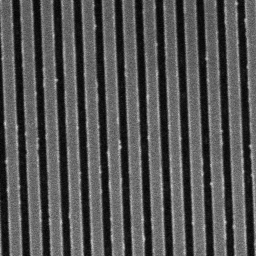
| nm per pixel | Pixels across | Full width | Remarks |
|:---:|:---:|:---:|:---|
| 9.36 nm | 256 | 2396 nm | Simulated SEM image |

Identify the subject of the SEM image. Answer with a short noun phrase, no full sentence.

parallel lines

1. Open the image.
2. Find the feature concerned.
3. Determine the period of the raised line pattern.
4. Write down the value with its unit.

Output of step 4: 191 nm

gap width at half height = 0.0748 microns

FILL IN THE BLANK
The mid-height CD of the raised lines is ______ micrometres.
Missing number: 0.115